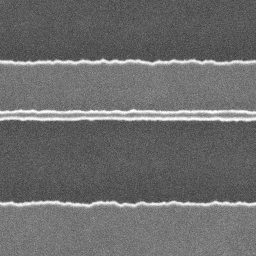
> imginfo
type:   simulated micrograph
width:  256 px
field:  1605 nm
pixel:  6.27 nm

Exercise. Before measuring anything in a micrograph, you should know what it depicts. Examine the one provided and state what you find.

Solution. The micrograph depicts lines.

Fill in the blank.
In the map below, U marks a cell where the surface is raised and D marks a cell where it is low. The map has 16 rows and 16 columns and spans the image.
DDDDDDDDDDDDDDDD
DDDDDDDDDDDDDDDD
DDDDDDDDDDDDDDDD
DDDDDDDDDDDDDDDD
UUUUUUUUUUUUUUUU
UUUUUUUUUUUUUUUU
UUUUUUUUUUUUUUUU
DDDDDDDDDDDDDDDD
DDDDDDDDDDDDDDDD
DDDDDDDDDDDDDDDD
DDDDDDDDDDDDDDDD
DDDDDDDDDDDDDDDD
DDDDDDDDDDDDDDDD
UUUUUUUUUUUUUUUU
UUUUUUUUUUUUUUUU
UUUUUUUUUUUUUUUU